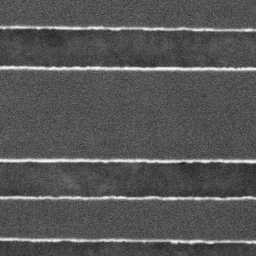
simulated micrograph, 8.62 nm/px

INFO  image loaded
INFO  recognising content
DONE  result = lines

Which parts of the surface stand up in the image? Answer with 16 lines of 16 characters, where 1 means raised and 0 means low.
1111111111111111
1111111111111111
0000000000000000
0000000000000000
1111111111111111
1111111111111111
1111111111111111
1111111111111111
1111111111111111
1111111111111111
0000000000000000
0000000000000000
1111111111111111
1111111111111111
1111111111111111
0000000000000000